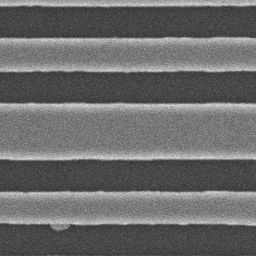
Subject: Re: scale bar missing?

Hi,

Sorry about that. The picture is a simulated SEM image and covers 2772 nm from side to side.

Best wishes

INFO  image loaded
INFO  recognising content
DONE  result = lines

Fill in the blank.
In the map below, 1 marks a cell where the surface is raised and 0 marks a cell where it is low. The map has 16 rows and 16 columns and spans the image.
0000000000000000
0000000000000000
1111111111111111
1111111111111111
0000000100000000
0000000000000000
0010000000000000
1111111111111111
1111111111111111
1111111111111111
0000000000000000
0000000000000000
1111111111111111
1111111111111111
0000000000000000
0000000000000000